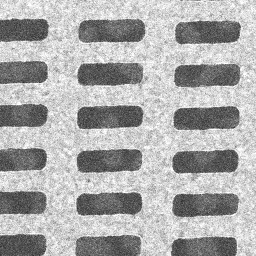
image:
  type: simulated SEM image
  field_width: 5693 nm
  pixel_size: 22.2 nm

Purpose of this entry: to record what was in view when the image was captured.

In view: a regular array of holes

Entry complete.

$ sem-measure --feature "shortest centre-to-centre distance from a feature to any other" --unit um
0.956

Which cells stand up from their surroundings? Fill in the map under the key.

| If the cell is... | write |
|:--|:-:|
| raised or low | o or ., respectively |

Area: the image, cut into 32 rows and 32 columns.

oooooooooooooooooooooooooooooooo
oooooooooooooooooooooooooooooooo
......ooooo.......oooooooooo.ooo
......oooo........oooo........oo
......oooo........oooo........oo
oooooooooooooooooooooo......oooo
oooooooooooooooooooooooooooooooo
oooooooooooooooooooooooooooooooo
......oooo........oooo........oo
......oooo........oooo........oo
...ooooooo.......ooooo........oo
oooooooooooooooooooooooooooooooo
oooooooooooooooooooooooooooooooo
......oooo........ooooo.......oo
......oooo........oooo........oo
......oooo........oooo........oo
oooooooooooooooooooooooooooooooo
oooooooooooooooooooooooooooooooo
oo...ooooooooooooooooooooooooooo
......oooo........oooo........oo
......oooo........ooo.........oo
..oooooooo.....o.ooooo.......ooo
oooooooooooooooooooooooooooooooo
oooooooooooooooooooooooooooooooo
......oooo........oooo........oo
......ooo.........ooo.........oo
.....ooooo.......ooooo........oo
oooooooooooooooooooooooooooooooo
oooooooooooooooooooooooooooooooo
......oooooo.....oooooooooo.oooo
......ooo.........ooo.........oo
......ooo.........ooo.........oo